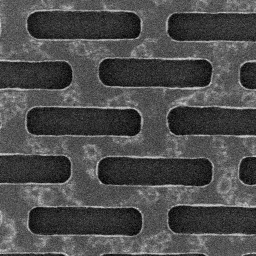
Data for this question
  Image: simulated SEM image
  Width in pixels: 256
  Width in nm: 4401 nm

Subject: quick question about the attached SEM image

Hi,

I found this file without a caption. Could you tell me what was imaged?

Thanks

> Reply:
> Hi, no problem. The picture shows holes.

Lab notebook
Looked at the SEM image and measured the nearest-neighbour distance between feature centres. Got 1480 nanometres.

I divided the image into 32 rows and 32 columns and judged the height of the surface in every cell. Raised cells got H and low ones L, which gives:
HHHHHHHHHHHHHHHHHHHHHHHHHHHHHHHH
HHHHLLLLLLLLLLLLLHHHHHHHHHHHHHHH
HHHLLLLLLLLLLLLLLLHHHLLLLLLLLLLL
HHHLLLLLLLLLLLLLLLHHHLLLLLLLLLLL
HHHHLLLLLLLLLLLLLHHHHLLLLLLLLLLL
HHHHHHHHHHHHHHHHHHHHHHHHHHHHHHHH
HHHHHHHHHHHHHHHHHHHHHHHHHHHHHHHH
HHHHHHHHHHHHHLLLLLLLLLLLLLHHHHHH
LLLLLLLLLHHHLLLLLLLLLLLLLLLHHHLL
LLLLLLLLLHHHLLLLLLLLLLLLLLHHHHLL
LLLLLLLLLHHHHLLLLLLLLLLLLLHHHHLL
HHHHHHHHHHHHHHHHHHHHHHHHHHHHHHHH
HHHHHHHHHHHHHHHHHHHHHHHHHHHHHHHH
HHHHLLLLLLLLLLHHHHHHHHLLLLLLLHHH
HHHLLLLLLLLLLLLLLLHHHLLLLLLLLLLL
HHHLLLLLLLLLLLLLLLHHHLLLLLLLLLLL
HHHHLLLLLLLLLLLLLHHHHLLLLLLLLLLL
HHHHHHHHHHHHHHHHHHHHHHHHHHHHHHHH
HHHHHHHHHHHHHHHHHHHHHHHHHHHHHHHH
LLLLLLLLHHHHHHHHHHHHHHHHHHHHHHHH
LLLLLLLLLHHHLLLLLLLLLLLLLLHHHHLL
LLLLLLLLLHHHLLLLLLLLLLLLLLLHHHLL
LLLLLLLLHHHHLLLLLLLLLLLLLLHHHHLL
HHHHHHHHHHHHHHHHHHHHHHHHHHHHHHHH
HHHHHHHHHHHHHHHHHHHHHHHHHHHHHHHH
HHHHHHHHHHHHHHHHHHHHHHHHHHHHHHHH
HHHHLLLLLLLLLLLLLHHHHLLLLLLLLLLL
HHHHLLLLLLLLLLLLLLHHHLLLLLLLLLLL
HHHHLLLLLLLLLLLLLLHHHLLLLLLLLLLL
HHHHHHHHHHHHHHLLHHHHHHHHHHHHHHHH
HHHHHHHHHHHHHHHHHHHHHHHHHHHHHHHH
HHHHHHHHHHHHHHHHHHHHHHHHHHHHHHHH